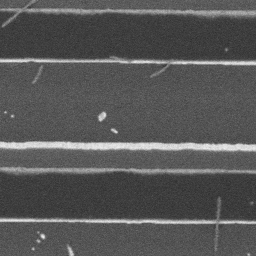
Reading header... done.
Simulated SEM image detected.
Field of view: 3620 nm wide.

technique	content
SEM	lines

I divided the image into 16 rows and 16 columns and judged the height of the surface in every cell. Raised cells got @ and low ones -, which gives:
@@@@@@@@@@@@@@@@
@@@@@@@@@@@@@@@@
@@@@@@@@@@@@@@@@
@@@@@@@@@@@@@@@@
----------------
----------------
----------------
----------------
----------------
@@@@@@@@@@@@@@@@
@@@@@@@@@@@@@@@@
@@@@@@@@@@@@@@@@
@@@@@@@@@@@@@@@@
@@@@@@@@@@@@@@@@
----------------
----------------